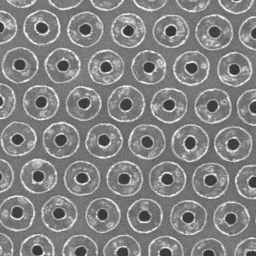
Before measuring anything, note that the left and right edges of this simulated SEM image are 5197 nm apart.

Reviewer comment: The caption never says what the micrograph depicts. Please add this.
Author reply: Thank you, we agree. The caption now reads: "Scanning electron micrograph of a regular array of ring-shaped raised bodies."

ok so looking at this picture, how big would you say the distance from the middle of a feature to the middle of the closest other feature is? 861 nm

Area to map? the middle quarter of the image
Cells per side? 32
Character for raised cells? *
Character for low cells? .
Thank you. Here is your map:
.***..***...***..***...**..***..
.***..***...***..***..***..****.
***...*********..********...****
**.....*******....*******...****
........*****......*****.....***
................................
..*****......*****.......***....
.*******....********...*******..
.****.***..*********..*********.
.***...**..***...***..***...***.
.***..***..***...***..***...***.
.********..***..****..***..****.
..******...********...********..
...****.....******.....******...
.........................***....
**......*****......****.......**
***....*******...*******.....***
****..********...********...****
.***..***..****.****..***..****.
.***..***..****.***...***..***..
****..********..****..***..***..
***...********...********..*****
**.....******....*******....****
....................**.......***
...**.........**.........*......
.******.....******.....******...
.*******...********...********..
***..****..***..***..****..***..
***...***..***...***.***...***..
***...***..***..****.****..***..
.********..********...********..
.*******....*******...*******...